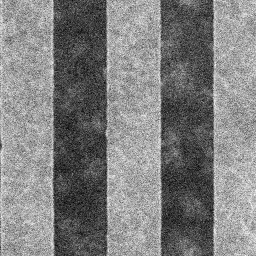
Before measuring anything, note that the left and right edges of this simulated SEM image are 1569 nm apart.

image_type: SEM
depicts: one or a few lines or trenches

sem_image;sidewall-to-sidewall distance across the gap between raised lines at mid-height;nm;334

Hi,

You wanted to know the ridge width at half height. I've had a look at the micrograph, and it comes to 322 nm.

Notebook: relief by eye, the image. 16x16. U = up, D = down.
UUUDDDDUUUDDDUUU
UUUDDDDUUUDDDUUU
UUUDDDDUUUDDDUUU
UUUDDDDUUUDDDUUU
UUUDDDDUUUDDDUUU
UUUDDDDUUUDDDUUU
UUUDDDDUUUDDDUUU
UUUDDDDUUUDDDUUU
UUUDDDDUUUDDDUUU
UUUDDDDUUUDDDUUU
UUUDDDDUUUDDDUUU
UUUDDDDUUUDDDUUU
UUUDDDDUUUDDDUUU
UUUDDDDUUUDDDUUU
UUUDDDDUUUDDDUUU
UUUDDDDUUUDDDUUU